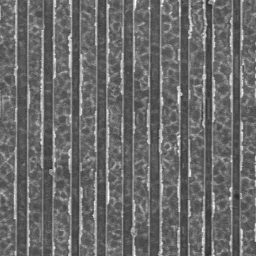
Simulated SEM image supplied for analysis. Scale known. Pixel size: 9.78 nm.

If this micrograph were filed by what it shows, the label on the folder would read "parallel lines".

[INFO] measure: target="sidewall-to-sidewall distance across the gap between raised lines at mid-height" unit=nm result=94.1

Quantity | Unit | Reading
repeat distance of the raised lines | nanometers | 261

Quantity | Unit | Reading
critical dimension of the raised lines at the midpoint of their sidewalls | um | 0.164